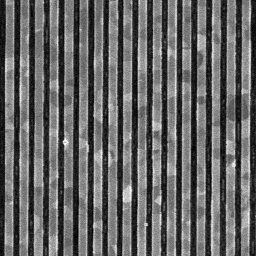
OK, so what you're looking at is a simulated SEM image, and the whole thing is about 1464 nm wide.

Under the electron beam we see parallel lines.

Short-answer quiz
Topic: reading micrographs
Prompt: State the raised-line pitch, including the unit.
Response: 84.6 nm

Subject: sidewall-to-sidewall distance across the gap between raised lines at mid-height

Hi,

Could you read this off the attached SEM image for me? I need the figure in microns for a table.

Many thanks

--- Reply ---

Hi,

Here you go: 0.0401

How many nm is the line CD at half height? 45.8